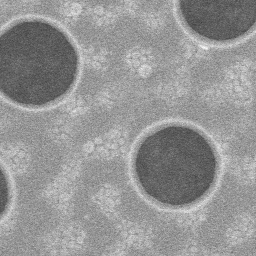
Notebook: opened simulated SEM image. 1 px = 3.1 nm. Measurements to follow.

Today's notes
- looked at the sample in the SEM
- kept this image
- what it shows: holes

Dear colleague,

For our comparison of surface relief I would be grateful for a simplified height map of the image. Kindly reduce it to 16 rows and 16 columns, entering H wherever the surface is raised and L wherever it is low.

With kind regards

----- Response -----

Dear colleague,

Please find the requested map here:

HHHHHHHHHHHLLLLL
HLLHHHHHHHHLLLLL
LLLLHHHHHHHHHLLH
LLLLLHHHHHHHHHHH
LLLLLHHHHHHHHHHH
LLLLHHHHHHHHHHHH
HLLHHHHHHHHHHHHH
HHHHHHHHHHHHHHHH
HHHHHHHHHLLLLHHH
HHHHHHHHLLLLLHHH
HHHHHHHHLLLLLLHH
LHHHHHHHHLLLLHHH
LHHHHHHHHHLLLHHH
HHHHHHHHHHHHHHHH
HHHHHHHHHHHHHHHH
HHHHHHHHHHHHHHHH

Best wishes